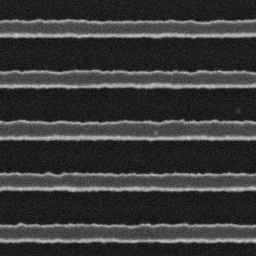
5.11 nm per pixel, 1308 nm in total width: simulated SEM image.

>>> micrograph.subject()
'lines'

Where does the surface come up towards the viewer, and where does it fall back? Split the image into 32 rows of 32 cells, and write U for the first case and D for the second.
DDDDDDDDDDDDDDDDDDDDDDDDDDDDDDDD
DDDDDDDDDDDDDDDDDDDDDDDDDDDDDDDD
DDDDUDDDUDDDDDDDDDDDDDDDDDDDDDDD
UUUUUUUUUUUUUUUUUUUUUUUUUUUUUUUU
UUUUUUUUUUUUUUUUUUUUUUUUUUUUUUUU
DDDDDDDDDDDDDDDDDDDDDDDDDDDDDDDD
DDDDDDDDDDDDDDDDDDDDDDDDDDDDDDDD
DDDDDDDDDDDDDDDDDDDDDDDDDDDDDDDD
DDDDDDDDDDDDDDDDDDDDDDDDDDDDDDDD
UUUUUUUUUUUUUUUUUUUUUUUUUUUUUUUU
UUUUUUUUUUUUUUUUUUUUUUUUUUUUUUUU
DDDDDDDDDDDDDDDDDDDDDDDDDDDDDDDD
DDDDDDDDDDDDDDDDDDDDDDDDDDDDDDDD
DDDDDDDDDDDDDDDDDDDDDDDDDDDDDDDD
DDDDDDDDDDDDDDDDDDDDDDDDDDDDDDDD
UUUUUUUUUUUUUUUUUUUUUUUUUUUUUUUU
UUUUUUUUUUUUUUUUUUUUUUUUUUUUUUUU
DDDDDDDDDDDDDDDDDDDDDDDDDDDDDDDD
DDDDDDDDDDDDDDDDDDDDDDDDDDDDDDDD
DDDDDDDDDDDDDDDDDDDDDDDDDDDDDDDD
DDDDDDDDDDDDDDDDDDDDDDDDDDDDDDDD
DDDDDDDDDDDDDDDDDDDDDDDDDDDDDDDD
UUUUUUUUUUUUUUUUUUUUUUUUUUUUUUUU
UUUUUUUUUUUUUUUUUUUUUUUUUUUUUUUU
DDDDDDDDDDDDDDDDDDDDDDDDDDDDDDDD
DDDDDDDDDDDDDDDDDDDDDDDDDDDDDDDD
DDDDDDDDDDDDDDDDDDDDDDDDDDDDDDDD
DDDDDDDDDDDDDDDDDDDDDDDDDDDDDDDD
UUUUUUUUUUUUUUUUUUUUUUUUUUUUUUUU
UUUUUUUUUUUUUUUUUUUUUUUUUUUUUUUU
DDDDDDDDDDDDDDDDDDDDDDDDDDDDDDDD
DDDDDDDDDDDDDDDDDDDDDDDDDDDDDDDD